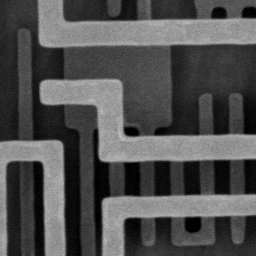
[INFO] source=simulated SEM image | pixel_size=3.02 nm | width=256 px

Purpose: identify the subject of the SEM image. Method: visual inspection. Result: wiring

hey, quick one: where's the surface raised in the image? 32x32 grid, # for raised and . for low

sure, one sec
.....###........................
.....###........................
.....###............############
.....###########################
.....###########################
.....#####################......
................................
................................
................................
................................
.....##########.................
.....##########.................
.....##########.................
............###.................
............###.................
............###.................
............###.................
............####################
########....####################
########....####################
#....###........................
#....###........................
#....###........................
#....###........................
#....###..................######
#....###.....###################
#.....##.....###################
#.....##.....###................
#.....##.....##.................
#.....##.....##.................
#.....##.....##.................
#.....##.....##.................